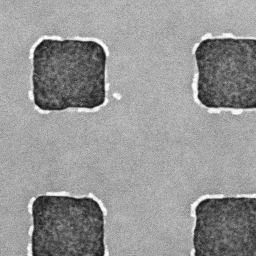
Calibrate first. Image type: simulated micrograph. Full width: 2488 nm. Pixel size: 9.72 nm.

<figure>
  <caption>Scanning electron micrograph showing holes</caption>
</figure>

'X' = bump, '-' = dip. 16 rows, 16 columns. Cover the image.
XXXXXXXXXXXXXXXX
XXXXXXXXXXXXXXXX
XXX--XXXXXXXX---
XX-----XXXXX----
XX-----XXXXX----
XX-----XXXXX----
XX----XXXXXXX---
XXXXXXXXXXXXXXXX
XXXXXXXXXXXXXXXX
XXXXXXXXXXXXXXXX
XXXXXXXXXXXXXXXX
XXXXXXXXXXXXXXXX
XX----XXXXXXX---
XX----XXXXXX----
XX----XXXXXX----
XX-----XXXXX----